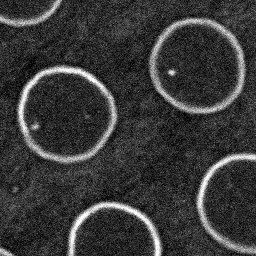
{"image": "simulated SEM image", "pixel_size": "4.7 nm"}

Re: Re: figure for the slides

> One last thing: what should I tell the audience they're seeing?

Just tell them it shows raised bodies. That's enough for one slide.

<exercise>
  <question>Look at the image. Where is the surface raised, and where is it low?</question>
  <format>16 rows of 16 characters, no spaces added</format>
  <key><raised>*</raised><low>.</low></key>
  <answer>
***.............
...........**...
..........*****.
..........*****.
...**.....*****.
..****....*****.
.******....***..
.******.........
..*****.........
..****..........
.............***
.............***
............****
.....****....***
.....*****...***
....******.....*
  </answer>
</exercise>